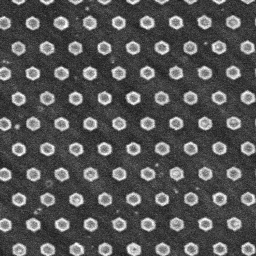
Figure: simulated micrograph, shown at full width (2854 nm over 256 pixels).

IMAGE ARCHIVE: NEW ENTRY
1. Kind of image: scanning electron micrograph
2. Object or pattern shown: a regular array of raised bodies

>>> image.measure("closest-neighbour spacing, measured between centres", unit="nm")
318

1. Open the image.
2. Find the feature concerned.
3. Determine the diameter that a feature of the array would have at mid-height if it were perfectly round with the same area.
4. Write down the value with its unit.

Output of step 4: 141 nm